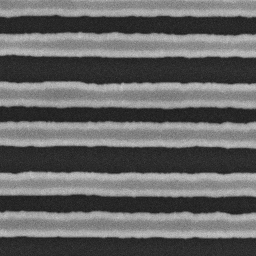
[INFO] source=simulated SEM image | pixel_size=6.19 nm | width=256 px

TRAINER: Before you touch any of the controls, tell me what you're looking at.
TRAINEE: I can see lines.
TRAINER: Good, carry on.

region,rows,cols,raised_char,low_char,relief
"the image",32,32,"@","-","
@@@@@@@@@@@@@@@@@@@@@@@@@@@@@@@@
@@@@@@@@@@@@@@@@@@@@@@@@@@@@@@@@
--------------------------------
--------------------------------
@-@@@@@@@@@@@@@@@@@@@---@-------
@@@@@@@@@@@@@@@@@@@@@@@@@@@@@@@@
@@@@@@@@@@@@@@@@@@@@@@@@@@@@@@@@
--------------------------------
--------------------------------
--------------------------------
@@---@@@@@----------@@--@-------
@@@@@@@@@@@@@@@@@@@@@@@@@@@@@@@@
@@@@@@@@@@@@@@@@@@@@@@@@@@@@@@@@
--------------------------------
--------------------------------
@@@@@@@@@@-@@@@@@@@-@@@@----@--@
@@@@@@@@@@@@@@@@@@@@@@@@@@@@@@@@
@@@@@@@@@@@@@@@@@@@@@@@@@@@@@@@@
--------------------------------
--------------------------------
--------------------------------
--------------------------------
@@@@@@@@@@@@@@@@@@@@@@@@@@@@@@@@
@@@@@@@@@@@@@@@@@@@@@@@@@@@@@@@@
--------------------------------
--------------------------------
--------------------------------
@@@@@@@@@@@@@@@@@@@@@@@@@@@@@@@@
@@@@@@@@@@@@@@@@@@@@@@@@@@@@@@@@
---------------------@@@--@@@---
--------------------------------
--------------------------------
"